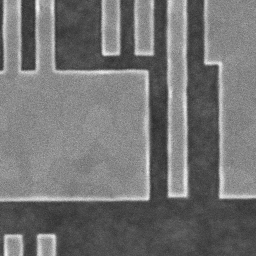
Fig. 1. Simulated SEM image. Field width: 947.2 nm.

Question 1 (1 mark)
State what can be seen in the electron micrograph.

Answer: wiring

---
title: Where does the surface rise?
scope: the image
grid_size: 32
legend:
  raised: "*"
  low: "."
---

.**..**......**..**..**...******
.**..**......**..**..**...******
.**..**......**..**..**...******
***..**......**..**..**...******
***..**......**..**..**...******
.**..**......**..**..**...******
.**..**......**..**..**...******
.**..**..............**...******
***.***..............**....*****
*******************..**....*****
*******************..**....*****
*******************..**....*****
******************...**....*****
*******************..**....*****
*******************..**....*****
*******************..**....*****
*******************..**....*****
*******************..**....*****
*******************..**....*****
*******************..**....*****
*******************..**....*****
*******************..**....*****
*******************..**....*****
*******************..**....*****
*******************..**....*****
................................
................................
................................
................................
.*...**.........................
.**..**.........................
.**..**.........................